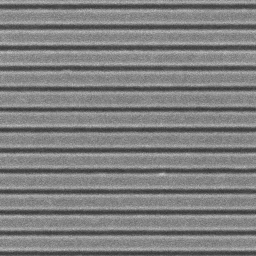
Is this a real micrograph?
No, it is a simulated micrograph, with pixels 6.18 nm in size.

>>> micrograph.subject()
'parallel lines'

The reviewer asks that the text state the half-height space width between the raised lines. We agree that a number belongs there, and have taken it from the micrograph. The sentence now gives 35.5 nanometers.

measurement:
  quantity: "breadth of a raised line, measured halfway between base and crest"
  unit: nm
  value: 89.6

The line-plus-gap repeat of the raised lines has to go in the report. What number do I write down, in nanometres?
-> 127